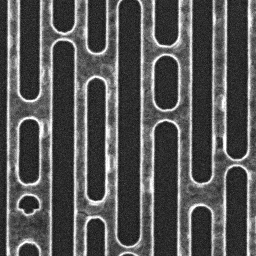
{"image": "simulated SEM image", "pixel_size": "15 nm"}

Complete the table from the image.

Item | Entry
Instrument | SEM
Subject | parallel lines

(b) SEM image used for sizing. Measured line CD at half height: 190 nm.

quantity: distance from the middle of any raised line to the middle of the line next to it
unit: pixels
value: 34.3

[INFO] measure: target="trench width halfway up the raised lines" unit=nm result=329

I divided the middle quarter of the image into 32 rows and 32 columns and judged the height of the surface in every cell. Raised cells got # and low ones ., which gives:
...##########......###.......###
...##########......###.......###
...##########......###.......###
...####..####......###.......###
...###....###......###.......###
...###.....##......###.......###
...##......##......#.........###
...##......##......###.......###
...##......##......###.......###
...##......##......####.....####
...##......##......####.....####
...##......##......#####...#####
...##......##......#############
...##......##......#############
...##......##......#####...#####
...##......##......####.....####
...##......##......###.......###
...##......##......###.......###
...##......##......###.......###
...##......##......###.......###
...##......##......###.......###
...##......##......###.......###
...##......##......###.......###
...##......##......###.......###
...##......##......###.......###
...##......##......###.......###
...##......##......###.......###
...##......##......###.......###
...##......##......###.......###
...##......##......###.......###
...##......##......###.......###
...##......##......###.......###